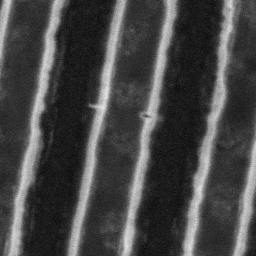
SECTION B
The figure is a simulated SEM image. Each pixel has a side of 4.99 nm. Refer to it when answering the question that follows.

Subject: one or a few lines or trenches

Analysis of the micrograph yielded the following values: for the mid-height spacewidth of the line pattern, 293 nm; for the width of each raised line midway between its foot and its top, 265 nanometers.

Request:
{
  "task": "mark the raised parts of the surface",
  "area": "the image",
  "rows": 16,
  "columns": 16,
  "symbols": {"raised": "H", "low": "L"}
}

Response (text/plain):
HHHHLLLHHHHLLLHH
HHHLLLLHHHHLLLHH
HHHLLLLHHHLLLLHH
HHHLLLLHHHLLLLHH
HHHLLLLHHHLLLLHH
HHHLLLLHHHLLLLHH
HHLLLLHHHHLLLLHH
HHLLLLHHHLLLLHHH
HHLLLLHHHLLLLHHH
HHLLLLHHHLLLLHHH
HHLLLLHHHLLLLHHH
HHLLLHHHHLLLHHHH
HLLLLHHHHLLLHHHH
HLLLLHHHLLLLHHHL
HLLLLHHHLLLLHHHL
HLLLLHHHLLLLHHHL